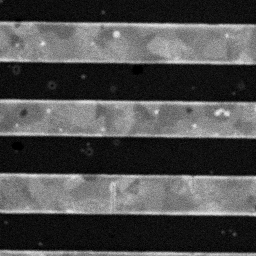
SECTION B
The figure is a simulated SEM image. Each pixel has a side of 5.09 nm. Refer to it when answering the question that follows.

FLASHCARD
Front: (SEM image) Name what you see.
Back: wiring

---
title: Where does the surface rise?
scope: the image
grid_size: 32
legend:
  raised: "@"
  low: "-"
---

--------------------------------
--------------------------------
--------------------------------
@@@@@@@@@@@@@@@@@@@@@@@@@@@@@@@@
@@@@@@@@@@@@@@@@@@@@@@@@@@@@@@@@
@@@@@@@@@@@@@@@@@@@@@@@@@@@@@@@@
@@@@@@@@@@@@@@@@@@@@@@@@@@@@@@@@
-@@@@@@@@@@@@@@@@@@@@@@@@@@@@@@@
--------------------------------
--------------------------------
--------------------------------
--------------------------------
--------------------------------
@@@@@@@@@@@@@@@@@@@@@@@@@@@@@@@@
@@@@@@@@@@@@@@@@@@@@@@@@@@@@@@@@
@@@@@@@@@@@@@@@@@@@@@@@@@@@@@@@@
@@@@@@@@@@@@@@@@@@@@@@@@@@@@@@@@
--------------------------------
--------------------------------
--------------------------------
--------------------------------
--------------------------------
@@@@@@@@@@@@@@@@@@@@@@@@@@@@@@@@
@@@@@@@@@@@@@@@@@@@@@@@@@@@@@@@@
@@@@@@@@@@@@@@@@@@@@@@@@@@@@@@@@
@@@@@@@@@@@@@@@@@@@@@@@@@@@@@@@@
------@@@@@@@@@@@@@@@@@@@@@@@@@@
--------------------------------
--------------------------------
--------------------------------
--------------------------------
@@@@@@@@@@@@--------------------